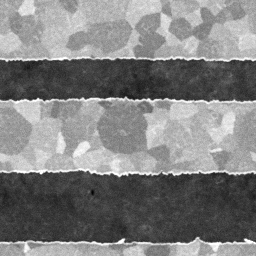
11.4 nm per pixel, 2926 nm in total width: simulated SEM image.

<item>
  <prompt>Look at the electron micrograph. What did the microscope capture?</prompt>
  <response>one or a few lines or trenches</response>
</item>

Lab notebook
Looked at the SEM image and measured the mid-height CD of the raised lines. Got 0.818 µm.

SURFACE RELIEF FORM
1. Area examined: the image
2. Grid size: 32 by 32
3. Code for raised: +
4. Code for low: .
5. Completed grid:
++++++++++++++++++++++++++++++++
++++++++++++++++++++++++++++++++
++++++++++++++++++++++++++++++++
++++++++++++++++++++++++++++++++
++++++++++++++++++++++++++++++++
++++++++++++++++++++++++++++++++
++++++++++++++++++++++++++++++++
..........................+++...
................................
................................
................................
................................
....+..+++++++++....+...........
++++++++++++++++++++++++++++++++
++++++++++++++++++++++++++++++++
++++++++++++++++++++++++++++++++
++++++++++++++++++++++++++++++++
++++++++++++++++++++++++++++++++
++++++++++++++++++++++++++++++++
++++++++++++++++++++++++++++++++
++++++++++++++++++++++++++++++++
............++++++++++++.+..+++.
................................
................................
................................
................................
................................
................................
................................
................................
++++++++++++..+++++...++++++++++
++++++++++++++++++++++++++++++++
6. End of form